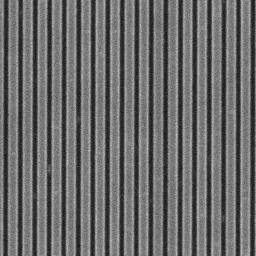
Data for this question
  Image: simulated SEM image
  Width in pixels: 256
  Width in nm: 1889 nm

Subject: parallel lines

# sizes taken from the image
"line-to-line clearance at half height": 5.5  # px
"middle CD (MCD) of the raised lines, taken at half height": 67.3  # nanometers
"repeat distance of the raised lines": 0.107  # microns